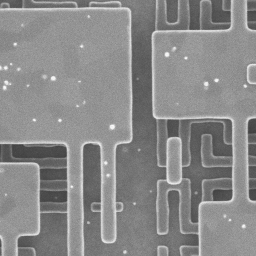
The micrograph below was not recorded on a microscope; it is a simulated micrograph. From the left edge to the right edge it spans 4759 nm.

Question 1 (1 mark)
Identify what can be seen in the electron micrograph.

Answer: wiring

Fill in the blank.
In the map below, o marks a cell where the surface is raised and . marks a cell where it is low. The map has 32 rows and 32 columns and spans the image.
.............................oo.
oooooooooooooooo.............oo.
oooooooooooooooo.............oo.
oooooooooooooooo.............oo.
oooooooooooooooo...ooooooooooooo
oooooooooooooooo...ooooooooooooo
oooooooooooooooo...ooooooooooooo
oooooooooooooooo...ooooooooooooo
oooooooooooooooo...ooooooooooooo
oooooooooooooooo...ooooooooooooo
oooooooooooooooo...ooooooooooooo
oooooooooooooooo...ooooooooooooo
oooooooooooooooo...ooooooooooooo
oooooooooooooooo...ooooooooooooo
oooooooooooooooo...ooooooooooooo
oooooooooooooooo.............oo.
ooooooooooooooooo............oo.
oooooooooooooooo.....o.......oo.
........oo..ooo......oo......oo.
........oo...o.......oo......oo.
oooo....oo...o.......oo......oo.
ooooo...oo...o.......oo......oo.
ooooo...oo...o.......oo......oo.
ooooo...oo...o...............oo.
ooooo...oo...o...............oo.
ooooo...oo...o...........ooooooo
ooooo...oo...o...........ooooooo
ooooo...oo...oo..........ooooooo
ooooo....o...oo..........ooooooo
ooo.....oo...oo..........ooooooo
oo......oo...............ooooooo
oo.......o...............ooooooo